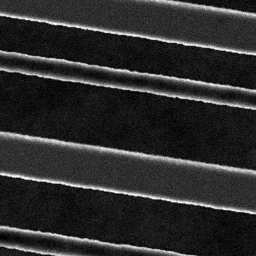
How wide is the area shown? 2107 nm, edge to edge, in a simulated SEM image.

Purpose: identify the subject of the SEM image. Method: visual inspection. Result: lines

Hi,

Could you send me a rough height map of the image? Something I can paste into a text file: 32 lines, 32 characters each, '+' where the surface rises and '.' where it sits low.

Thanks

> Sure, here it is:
+++++++++++++++++++++++.........
++++++++++++++++++++++++++++++..
....++++++++++++++++++++++++++++
..........++++++++++++++++++++++
................++++++++++++++++
.......................+++++++++
+............................+++
++++++++........................
++++++++++++++..................
.....+++++++++++++++............
...........+++++++++++++++......
..................++++++++++++++
........................++++++++
..............................++
................................
................................
................................
++++++..........................
++++++++++++....................
++++++++++++++++++..............
+++++++++++++++++++++++++.......
+++++++++++++++++++++++++++++++.
....++++++++++++++++++++++++++++
...........+++++++++++++++++++++
..................++++++++++++++
........................++++++++
..............................++
................................
+...............................
++++++++........................
++++++++++++++..................
....++++++++++++++++++..........